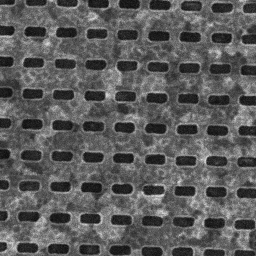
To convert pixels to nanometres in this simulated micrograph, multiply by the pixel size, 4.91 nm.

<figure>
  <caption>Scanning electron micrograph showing a regular array of holes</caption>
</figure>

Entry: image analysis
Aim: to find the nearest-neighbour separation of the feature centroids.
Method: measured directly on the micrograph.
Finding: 150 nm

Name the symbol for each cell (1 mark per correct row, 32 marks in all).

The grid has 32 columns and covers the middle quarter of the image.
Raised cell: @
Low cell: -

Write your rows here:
---@@------@@-----@@@-----@@@---
@@@@@@----@@@-----@@@-----@@@---
@@@@@@@@@@@@@@@@@@@@@@@@@@@@@@@@
@@@@@@@@@@@@@@@@@@@@@@@@@@@@@@@@
@@@@@@@@@@@@@@@@@@@@@@@@@@@@@@@@
@@@@@@@@@@@@@@@@@@@@@@@@@@@@@@@@
--@@@@@---@@@@@@@@@@@@@@@@@@@@@@
---@@-----@@@-----@@@-----@@@---
--@@@-----@@@-----@@------@@----
@@@@@@@@@@@@@@---@@@@-----@@----
@@@@@@@@@@@@@@@@@@@@@@@@@@@@@@@@
@@@@@@@@@@@@@@@@@@@@@@@@@@@@@@@@
@@@@@@@@@@@@@@@@@@@@@@@@@@@@@@@@
@@@@@@@@@@@@@@@@@@@@@@@@@@@@@@@@
--@@@-----@@@@--@@@@@@@@@@@@@@@@
--@@@-----@@------@@------@@----
--@@@-----@@@-----@@------@@----
@@@@@@@@@@@@@@@@@@@@@-@--@@@----
@@@@@@@@@@@@@@@@@@@@@@@@@@@@@@@@
@@@@@@@@@@@@@@@@@@@@@@@@@@@@@@@@
@@@@@@@@@@@@@@@@@@@@@@@@@@@@@@@@
@@@@@@@@@@@@@@@@@@@@@@@@@@@@@@@@
--@@@-----@@@----@@@@----@@@@@@@
--@@------@@------@@------@@----
-@@@@----@@@-----@@@-----@@@----
@@@@@@@@@@@@@@@@@@@@@@@@@@@@----
@@@@@@@@@@@@@@@@@@@@@@@@@@@@@@@@
@@@@@@@@@@@@@@@@@@@@@@@@@@@@@@@@
@@@@@@@@@@@@@@@@@@@@@@@@@@@@@@@@
-@@@@-@@@@@@@@@@@@@@@@@@@@@@@@@@
--@@------@@-----@@@-----@@@----
--@@------@@-----@@@-----@@@----